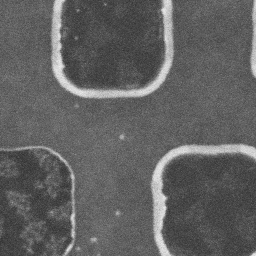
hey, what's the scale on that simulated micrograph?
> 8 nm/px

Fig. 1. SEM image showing raised bodies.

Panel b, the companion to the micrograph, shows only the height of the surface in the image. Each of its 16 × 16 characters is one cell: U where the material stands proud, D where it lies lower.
DDDDUUUUUUUDDDDD
DDDUUUUUUUUDDDDD
DDDUUUUUUUUDDDDD
DDDUUUUUUUUDDDDD
DDDDUUUUUUDDDDDD
DDDDUUUUUDDDDDDD
DDDDDDDDDDDDDDDD
DDDDDDDDDDDDDDDD
DDDDDDDDDDDDDDDD
DDDDDDDDDDDUUUUU
DDDDDDDDDDUUUUUU
DDDDDDDDDDUUUUUU
DDDDDDDDDDUUUUUU
DDDDDDDDDDUUUUUU
DDDDDDDDDDUUUUUU
DDDDDDDDDDUUUUUU